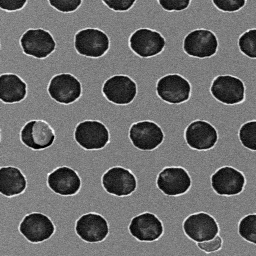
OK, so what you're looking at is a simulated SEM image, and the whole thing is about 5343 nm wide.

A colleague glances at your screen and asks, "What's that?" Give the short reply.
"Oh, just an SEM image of a regular array of holes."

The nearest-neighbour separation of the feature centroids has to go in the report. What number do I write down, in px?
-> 53.1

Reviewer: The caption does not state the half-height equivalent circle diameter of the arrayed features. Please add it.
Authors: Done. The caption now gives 653 nm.